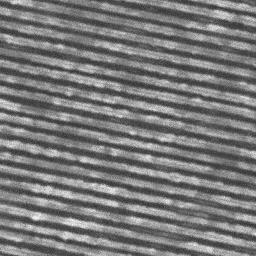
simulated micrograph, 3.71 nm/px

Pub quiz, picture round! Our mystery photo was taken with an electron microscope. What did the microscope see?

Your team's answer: parallel lines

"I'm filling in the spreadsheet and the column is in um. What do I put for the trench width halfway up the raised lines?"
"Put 0.0246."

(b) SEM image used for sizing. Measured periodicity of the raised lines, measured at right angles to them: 0.0478 micrometres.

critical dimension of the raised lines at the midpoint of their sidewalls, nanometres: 21.4